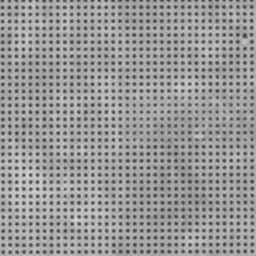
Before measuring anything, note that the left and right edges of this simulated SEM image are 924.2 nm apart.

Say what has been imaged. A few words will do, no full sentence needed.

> a regular array of holes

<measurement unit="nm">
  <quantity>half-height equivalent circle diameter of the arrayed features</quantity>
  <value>15.8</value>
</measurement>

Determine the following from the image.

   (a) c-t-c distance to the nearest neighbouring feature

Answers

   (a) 24.3 nanometers